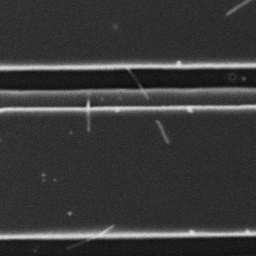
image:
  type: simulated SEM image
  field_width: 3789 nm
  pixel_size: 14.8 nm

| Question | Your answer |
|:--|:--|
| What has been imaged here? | lines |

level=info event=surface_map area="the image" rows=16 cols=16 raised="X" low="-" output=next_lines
XXXXXXXXXXXXXXXX
XXXXXXXXXXXXXXXX
XXXXXXXXXXXXXXXX
XXXXXXXXXXXXXXXX
----------------
----------------
XXXXXXXXXXXXXXXX
XXXXXXXXXXXXXXXX
XXXXXXXXXXXXXXXX
XXXXXXXXXXXXXXXX
XXXXXXXXXXXXXXXX
XXXXXXXXXXXXXXXX
XXXXXXXXXXXXXXXX
XXXXXXXXXXXXXXXX
XXXXXXXXXXXXXXXX
----------------